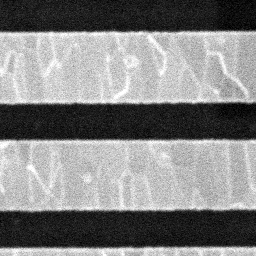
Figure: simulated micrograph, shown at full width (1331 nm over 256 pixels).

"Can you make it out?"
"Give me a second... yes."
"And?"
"lines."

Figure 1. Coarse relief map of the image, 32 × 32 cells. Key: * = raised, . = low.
................................
................................
................................
................................
********************************
********************************
********************************
********************************
********************************
********************************
********************************
********************************
********************************
................................
................................
................................
................................
................................
********************************
********************************
********************************
********************************
********************************
********************************
********************************
********************************
................................
................................
................................
................................
................................
********************************